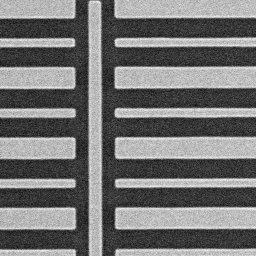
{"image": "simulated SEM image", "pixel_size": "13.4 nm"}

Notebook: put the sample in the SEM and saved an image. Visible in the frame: groups of lines, slits or small figures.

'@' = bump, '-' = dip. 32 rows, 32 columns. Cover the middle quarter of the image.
------@@@-----------------------
@@----@@@----@@@@@@@@@@@@@@@@@@@
@@----@@@----@@@@@@@@@@@@@@@@@@@
@@@---@@@----@@@@@@@@@@@@@@@@@@@
@@@---@@@----@@@@@@@@@@@@@@@@@@@
@@@---@@@----@@@@@@@@@@@@@@@@@@@
------@@@-----------------------
------@@@-----------------------
------@@@-----------------------
------@@@-----------------------
------@@@-----------------------
@@----@@@----@@@@@@@@@@@@@@@@@@@
@@@---@@@----@@@@@@@@@@@@@@@@@@@
------@@@-----------------------
------@@@-----------------------
------@@@-----------------------
------@@@-----------------------
------@@@-----------------------
------@@@-----------------------
@@@---@@@----@@@@@@@@@@@@@@@@@@@
@@@---@@@----@@@@@@@@@@@@@@@@@@@
@@@---@@@----@@@@@@@@@@@@@@@@@@@
@@@---@@@----@@@@@@@@@@@@@@@@@@@
@@----@@@----@@@@@@@@@@@@@@@@@@@
------@@@-----------------------
------@@@-----------------------
------@@@-----------------------
------@@@-----------------------
------@@@-----------------------
@@@---@@@----@@@@@@@@@@@@@@@@@@@
@@----@@@----@@@@@@@@@@@@@@@@@@@
------@@@-----------------------